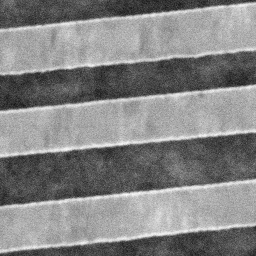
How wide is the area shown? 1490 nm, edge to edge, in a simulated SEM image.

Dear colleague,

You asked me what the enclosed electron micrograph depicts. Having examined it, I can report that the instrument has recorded lines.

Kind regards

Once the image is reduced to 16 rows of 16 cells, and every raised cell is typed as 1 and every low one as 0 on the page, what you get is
0000000000000111
0000111111111111
1111111111111111
1111111111110000
1100000000000000
0000000000000011
0000011111111111
1111111111111111
1111111111111000
1110000000000000
0000000000000000
0000000000000011
0000111111111111
1111111111111111
1111111111110000
1110000000000000